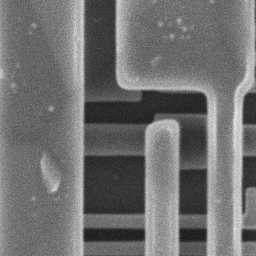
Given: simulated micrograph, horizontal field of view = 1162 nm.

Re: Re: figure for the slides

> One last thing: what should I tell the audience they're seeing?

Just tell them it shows wiring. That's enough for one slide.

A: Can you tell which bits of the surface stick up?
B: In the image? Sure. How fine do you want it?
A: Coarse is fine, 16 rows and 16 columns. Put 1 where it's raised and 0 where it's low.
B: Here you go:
1111100111111111
1111100111111111
1111100111111111
1111100111111111
1111100111111111
1111100011111111
1111100000000110
1111100000000110
1111100001100110
1111100001100110
1111100001100110
1111100001100110
1111100001100110
1111100001100110
1111100001100110
1111100001100110